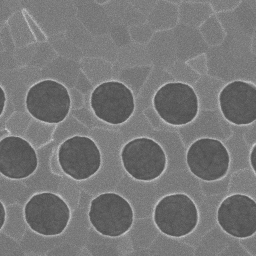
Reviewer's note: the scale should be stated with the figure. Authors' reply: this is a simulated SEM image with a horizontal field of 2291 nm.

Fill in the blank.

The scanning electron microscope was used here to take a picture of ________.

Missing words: a regular array of holes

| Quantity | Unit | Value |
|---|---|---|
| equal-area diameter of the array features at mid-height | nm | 386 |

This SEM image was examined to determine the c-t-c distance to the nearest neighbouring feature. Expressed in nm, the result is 571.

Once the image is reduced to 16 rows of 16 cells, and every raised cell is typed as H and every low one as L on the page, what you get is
HHHHHHHHHHHHHHHH
HHHHHHHHHHHHHHHH
HHHHHHHHHHHHHHHH
HHHHHHHHHHHHHHHH
HHHHHHHHHHHHHHHH
HHLLHHLLHHLLHHLL
HHLLHHLLHHLLHHLL
HHHLHHLLHHLLHHLL
HHHHHHHHHHHHHHHH
LLHHLLHHLLHHLLHH
LLHHLLHHLLHHLLHH
HHHHHHHHHHHHHHHH
HHLLHHLLHHLLHHLL
HHLLHHLLHHLLHHLL
HHLLHHLLHHLLHHLL
HHHHHHHHHHHHHHHH